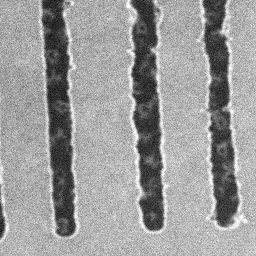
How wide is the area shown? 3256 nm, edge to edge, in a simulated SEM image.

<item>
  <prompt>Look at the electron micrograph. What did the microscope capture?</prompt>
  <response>one or a few lines or trenches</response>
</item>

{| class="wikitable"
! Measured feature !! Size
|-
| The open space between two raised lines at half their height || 644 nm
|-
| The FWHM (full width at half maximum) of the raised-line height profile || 322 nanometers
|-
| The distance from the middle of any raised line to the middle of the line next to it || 1.02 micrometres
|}